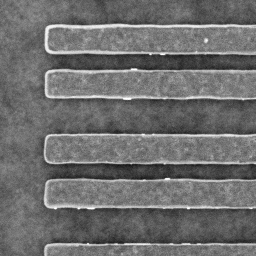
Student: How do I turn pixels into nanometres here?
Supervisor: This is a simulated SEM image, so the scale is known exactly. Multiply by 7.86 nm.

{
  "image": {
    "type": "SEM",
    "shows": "wiring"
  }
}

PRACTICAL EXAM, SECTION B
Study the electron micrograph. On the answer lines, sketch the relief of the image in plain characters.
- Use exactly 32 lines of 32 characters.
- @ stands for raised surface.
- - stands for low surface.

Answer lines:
--------------------------------
--------------------------------
--------------------------------
------@@@@@@@@@@@@@@@@@@@@@@@@@@
------@@@@@@@@@@@@@@@@@@@@@@@@@@
------@@@@@@@@@@@@@@@@@@@@@@@@@@
------@@@---@@@@@@@@@@@@@@@@@@@@
--------------------------------
--------------------------------
------@@@@@@@@@@@@@@@@@@@@@@@@@@
------@@@@@@@@@@@@@@@@@@@@@@@@@@
------@@@@@@@@@@@@@@@@@@@@@@@@@@
--------------------------------
--------------------------------
--------------------------------
--------------------------------
--------------------------------
------@@@@@@@@@@@@@@@@@@@@@@@@@@
------@@@@@@@@@@@@@@@@@@@@@@@@@@
------@@@@@@@@@@@@@@@@@@@@@@@@@@
--------------------------------
--------------------------------
------@@@@@@--------@@@@--------
------@@@@@@@@@@@@@@@@@@@@@@@@@@
------@@@@@@@@@@@@@@@@@@@@@@@@@@
------@@@@@@@@@@@@@@@@@@@@@@@@@@
--------------------------------
--------------------------------
--------------------------------
--------------------------------
--------------------------@@----
------@@@@@@@@@@@@@@@@@@@@@@@@@@